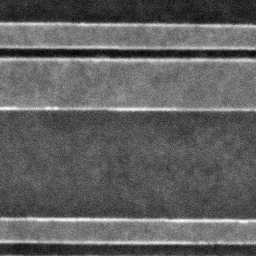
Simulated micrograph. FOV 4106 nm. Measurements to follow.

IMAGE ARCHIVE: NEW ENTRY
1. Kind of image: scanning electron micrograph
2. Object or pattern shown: lines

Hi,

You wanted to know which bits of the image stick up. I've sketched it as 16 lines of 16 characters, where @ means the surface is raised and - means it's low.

----------------
----------------
@@@@@@@@@@@@@@@@
@@@@@@@@@@@@@@@@
@@@@@@@@@@@@@@@@
@@@@@@@@@@@@@@@@
@@@@@@@@@@@@@@@@
----------------
----------------
----------------
----------------
----------------
----------------
----------------
@@@@@@@@@@@@@@@@
@@@@@@@@@@@@@@@@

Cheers